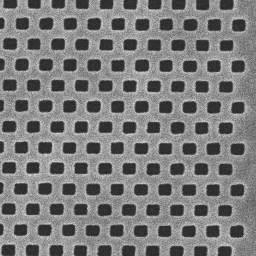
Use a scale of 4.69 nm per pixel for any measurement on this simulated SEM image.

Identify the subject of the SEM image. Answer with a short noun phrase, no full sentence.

a regular array of holes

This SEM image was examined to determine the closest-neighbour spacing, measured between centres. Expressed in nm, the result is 111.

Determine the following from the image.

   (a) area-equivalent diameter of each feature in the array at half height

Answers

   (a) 0.0663 µm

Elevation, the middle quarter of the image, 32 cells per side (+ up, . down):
...+++...+++...+++...+++...+++..
...+++...+++...+++...+++...+++..
++++++++++++++++++++++++++++++++
++++++++++++++++++++++++++++++++
+++...+++...+++...+++...+++...++
+++...+++...+++...+++...+++...++
+++...+++...+++...+++...+++...++
++++++++++++++++++++++++++++++++
++++++++++++++++++++++++++++++++
...+++...+++...+++...+++...+++..
...+++...+++...+++...+++...+++..
...+++...+++...+++...+++...+++..
++++++++++++++++++++++++++++++..
++++++++++++++++++++++++++++++++
+++...+++...+++...+++..+++++.+++
+++...+++...+++...+++...+++...++
+++...+++...+++...+++...+++...++
++++++++++++++++++++++.++++..+++
++++++++++++++++++++++++++++++++
..++++...+++++++++++++++++++++++
...++....+++...++....+++...+++..
...++....+++...++....+++...++...
..++++..++++..++++...+++...+++..
++++++++++++++++++++++++++++++++
+++..+++++++++++++++++++++++++++
++....+++...++....+++...+++...++
++....++....++....+++...++....++
+++..++++..++++...+++...+++...++
++++++++++++++++++++++++++++++++
++++++++++++++++++++++++++++++++
...+++...+++...+++...+++...+++..
...++....++....++....++....++...